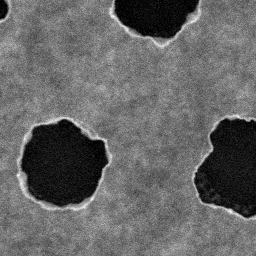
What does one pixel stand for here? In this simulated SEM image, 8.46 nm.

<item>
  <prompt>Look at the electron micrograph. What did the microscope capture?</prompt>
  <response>holes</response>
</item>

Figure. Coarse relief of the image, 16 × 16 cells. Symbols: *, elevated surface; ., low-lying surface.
.******.....****
********....****
****************
****************
****************
****************
****************
**************..
**....*******...
*......******...
*......*****....
**....******....
**...********...
***************.
****************
****************